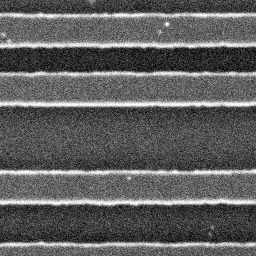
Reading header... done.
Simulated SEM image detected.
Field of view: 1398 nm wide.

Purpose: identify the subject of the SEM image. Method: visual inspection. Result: lines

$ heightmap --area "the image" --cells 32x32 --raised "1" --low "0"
00000000000000000000000000000000
00000000000000000000000000000000
11111111111111111111111111111111
11111111111111111111111111111111
11111111111111111111111111111111
11111111111111111111111111111111
00000000000000000000000000000000
00000000000000000000000000000000
00000000000000000000000000000000
11111111111111111111111111111111
11111111111111111111111111111111
11111111111111111111111111111111
11111111111111111111111111111111
00000000000000000000000000000000
00000000000000000000000000000000
00000000000000000000000000000000
00000000000000000000000000000000
00000000000000000000000000000000
00000000000000000000000000000000
00000000000000000000000000000000
00000000000000000000000000000000
11111111111111111111111011111111
11111111111111111111111111111111
11111111111111111111111111111111
11111111111111111111111111111111
00000011000011101100110000000000
00000000000000000000000000000000
00000000000000000000000000000000
00000000000000000000000000000000
00000000000000000000000000000000
11111111110001111111001111111101
11111111111111111111111111111111